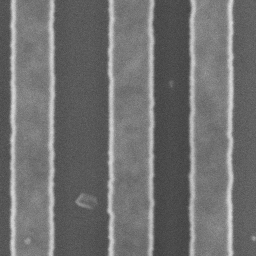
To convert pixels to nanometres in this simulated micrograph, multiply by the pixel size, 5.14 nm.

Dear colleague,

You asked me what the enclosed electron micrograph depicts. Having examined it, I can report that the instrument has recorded lines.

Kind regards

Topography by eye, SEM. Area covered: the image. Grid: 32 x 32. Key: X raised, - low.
-XXXXXX-------XXXXX-----XXXXX---
-XXXXXX-------XXXXX-----XXXXX---
-XXXXXX-------XXXXX-----XXXXX---
-XXXXXX-------XXXXX-----XXXXX---
-XXXXXX-------XXXXX-----XXXXX---
-XXXXXX-------XXXXX-----XXXXX---
-XXXXXX-------XXXXX-----XXXXX---
-XXXXXX-------XXXXX-----XXXXX---
-XXXXXX-------XXXXX-----XXXXX---
-XXXXXX-------XXXXX-----XXXXX---
-XXXXXX-------XXXXX-----XXXXX---
-XXXXXX-------XXXXX-----XXXXX---
-XXXXXX-------XXXXX-----XXXXX---
-XXXXXX-------XXXXX-----XXXXX---
-XXXXXX-------XXXXX-----XXXXX---
-XXXXXX-------XXXXX-----XXXXX---
-XXXXXX-------XXXXX-----XXXXX---
-XXXXXX-------XXXXX-----XXXXX---
-XXXXXX-------XXXXX-----XXXXX---
-XXXXXX-------XXXXX-----XXXXX---
-XXXXXX-------XXXXX-----XXXXX---
-XXXXXX-------XXXXX-----XXXXX---
-XXXXXX-------XXXXX-----XXXXX---
-XXXXXX-------XXXXX-----XXXXX---
-XXXXXX-------XXXXX-----XXXXX---
-XXXXXX-------XXXXX-----XXXXX---
-XXXXXX-------XXXXX-----XXXXX---
-XXXXXX-------XXXXX-----XXXXX---
-XXXXXX-------XXXXX-----XXXXX---
-XXXXXX-------XXXXX-----XXXXX---
-XXXXXX-------XXXXX-----XXXXX---
-XXXXXX-------XXXXX-----XXXXX---